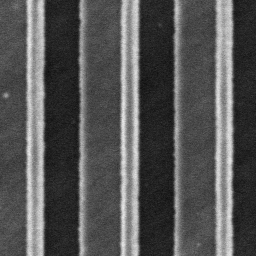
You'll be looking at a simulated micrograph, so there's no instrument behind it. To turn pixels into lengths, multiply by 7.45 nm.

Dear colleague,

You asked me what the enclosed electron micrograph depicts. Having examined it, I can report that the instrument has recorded lines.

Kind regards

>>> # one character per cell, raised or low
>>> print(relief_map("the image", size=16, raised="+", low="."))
+++..++++..+++..
+++..++++..+++..
+++..++++..+++..
+++..++++..+++..
+++..++++..+++..
+++..++++..+++..
+++..++++..+++..
+++..++++..+++..
+++..++++..+++..
+++..++++..+++..
+++..++++..+++..
+++..++++..+++..
+++..++++..+++..
+++..++++..+++..
+++..++++..+++..
+++..++++..+++..